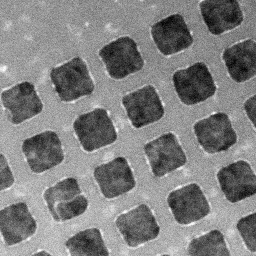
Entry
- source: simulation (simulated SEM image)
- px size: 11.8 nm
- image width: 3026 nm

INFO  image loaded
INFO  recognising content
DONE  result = a regular array of raised bodies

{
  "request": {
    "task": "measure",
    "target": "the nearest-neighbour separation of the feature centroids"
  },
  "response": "633 nm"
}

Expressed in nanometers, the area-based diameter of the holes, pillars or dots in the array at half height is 498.